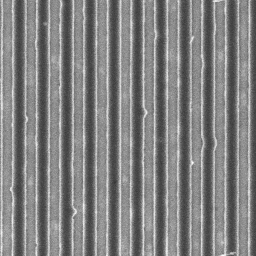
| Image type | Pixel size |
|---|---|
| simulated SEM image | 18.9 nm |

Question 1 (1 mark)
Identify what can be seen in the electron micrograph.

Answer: parallel lines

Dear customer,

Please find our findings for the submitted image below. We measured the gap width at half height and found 192 nm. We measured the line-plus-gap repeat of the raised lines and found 23.6 px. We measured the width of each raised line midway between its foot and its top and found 251 nm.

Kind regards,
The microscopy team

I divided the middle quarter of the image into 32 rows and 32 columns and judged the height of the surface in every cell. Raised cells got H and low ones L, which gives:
HHLLLHHHLLLHHHLLLHHHLLLHHHLLHHHH
HHLLLHHHLLLHHHLLLHHHLLLHHHLLHHHH
HHLLLHHHLLLHHHLLLHHHLLLHHHLLHHHH
HHLLLHHHLLLHHHLLLHHHLLLHHHLLLHHH
HHLLLHHHLLLHHHLLLHHHLLLHHHLLLHHH
HHLLLHHHLLLHHHLLLHHHLLLHHHLLLHHH
HHLLLHHHLLLHHHLLLHHHLLLHHHLLLHHH
HHLLLHHHLLLHHHLLLHHHLLLHHHLLLHHH
HHLLLHHHLLLHHHLLLHHHLLLHHHLLLHHH
HHLLLHHHLLLHHHLLLHHHLLLHHHLLHHHH
HHLLLHHHLLLHHHLLLHHHLLLHHHLLHHHH
HHLLLHHHLLLHHHLLLHHHLLLHHHLLHHHH
HHLLLHHHLLLHHHLLLHHHHLLHHHLLLHHH
HHLLLHHHLLLHHHLLLHHHLLLHHHLLLHHH
HHLLLHHHLLLHHHLLLHHHLLLHHHLLHHHH
HHLLLHHHLLLHHHLLLHHHLLLHHHLLLHHH
HHLLLHHHLLLHHHLLLHHHLLLHHHLLLHHH
HHLLLHHHLLLHHHLLLHHHLLLHHHLLLHHH
HHLLLHHHLLLHHHLLLHHHLLLHHHLLHHHH
HHLLLHHHLLLHHHLLLHHHLLLHHHLLHHHH
HHLLLHHHLLLHHHLLLHHHLLLHHHLLHHHH
HHLLLHHHLLLHHHLLLHHHLLLHHHLLHHHH
HHLLLHHHLLLHHHLLLHHHLLLHHHLLLHHH
HHLLLHHHLLLHHHLLLHHHLLLHHHLLLHHH
HHLLLHHHLLLHHHLLLHHHLLLHHHLLHHHH
HHLLLHHHLLLHHHLLLHHHLLLHHHLLHHHH
HHLLLHHHLLLHHHLLLHHHLLLHHHLLHHHH
HHLLLHHHLLLHHHLLLHHHLLLHHHLLHHHH
HHLLLHHHLLLHHHLLLHHHLLLHHHLLHHHH
HHLLLHHHLLLHHHLLLHHHLLLHHHLLHHHH
HHLLLHHHLLLHHHLLLHHHLLLHHHLLHHHH
HHLLLHHHLLLHHHLLLHHHLLLHHHLLHHHH